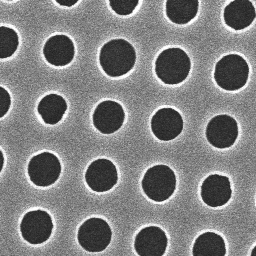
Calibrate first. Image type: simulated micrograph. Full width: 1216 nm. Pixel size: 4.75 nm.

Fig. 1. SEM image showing a regular array of holes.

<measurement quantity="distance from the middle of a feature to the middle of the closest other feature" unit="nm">272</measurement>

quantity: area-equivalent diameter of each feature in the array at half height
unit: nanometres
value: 158